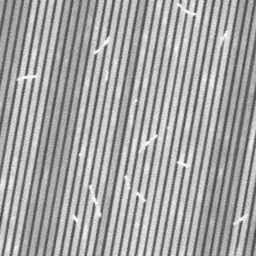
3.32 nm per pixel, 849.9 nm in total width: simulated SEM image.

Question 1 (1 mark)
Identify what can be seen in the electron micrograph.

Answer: parallel lines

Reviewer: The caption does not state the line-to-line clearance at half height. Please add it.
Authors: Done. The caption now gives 0.0118 µm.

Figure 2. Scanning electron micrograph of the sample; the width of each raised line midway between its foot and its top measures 0.0176 µm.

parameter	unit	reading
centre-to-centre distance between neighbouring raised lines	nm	27.2